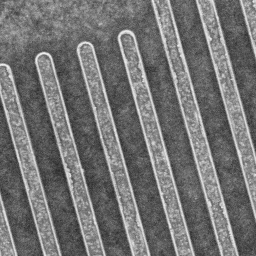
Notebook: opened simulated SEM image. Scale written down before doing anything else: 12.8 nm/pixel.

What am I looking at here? parallel lines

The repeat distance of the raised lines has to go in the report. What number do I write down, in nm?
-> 545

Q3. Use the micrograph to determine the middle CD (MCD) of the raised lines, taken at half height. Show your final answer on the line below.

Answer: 199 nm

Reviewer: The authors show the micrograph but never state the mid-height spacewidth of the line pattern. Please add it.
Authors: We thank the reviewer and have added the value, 351 nm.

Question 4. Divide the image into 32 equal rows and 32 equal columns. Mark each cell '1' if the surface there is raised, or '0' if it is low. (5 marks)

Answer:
00000000000000000001100001100011
00000000000000000001100001100001
00000000000000000000110001100001
00000000000000000000110000100001
00000000000000011000110000110001
00000000001000011000011000110000
00000000001100011000011000110000
00000100001100001100011000011000
10000110001100001100011000011000
10000110000110001100001100011000
11000110000110001100001100001000
11000011000110000110001100001100
11000011000110000110001100001100
01100011000011000110000110001100
01100011000011000110000110000100
01100001100011000011000110000110
01100001100001100011000011000110
00110001100001100011000011000110
00110001100001100001100011000011
00110000110001100001100011000011
00010000110000110001100001100011
00011000110000110001100001100011
00011000011000110000110001100001
00011000011000110000110001100001
00001100011000011000110000110001
00001100011000011000110000110000
10001100001100011000011000110000
10001100001100011000011000011000
10000110001100001100011000011000
10000110001100001100001100011000
11000110000110001100001100011000
11000010000110000110001100001100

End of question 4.